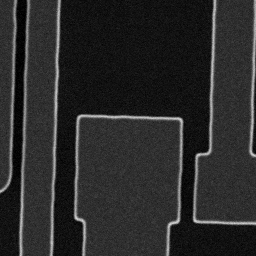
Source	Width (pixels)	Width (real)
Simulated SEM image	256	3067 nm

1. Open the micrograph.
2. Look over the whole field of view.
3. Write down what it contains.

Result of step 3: groups of lines, slits or small figures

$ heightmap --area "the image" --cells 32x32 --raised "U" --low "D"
UUDDUUUDDDDDDDDDDDDDDDDDDDDUUUUU
UUDUUUUDDDDDDDDDDDDDDDDDDDDUUUUU
UUDUUUUDDDDDDDDDDDDDDDDDDDDUUUUU
UUDUUUUDDDDDDDDDDDDDDDDDDDDUUUUU
UUDUUUUDDDDDDDDDDDDDDDDDDDDUUUUU
UUDUUUUDDDDDDDDDDDDDDDDDDDDUUUUU
UUDUUUUDDDDDDDDDDDDDDDDDDDDUUUUU
UUDUUUUDDDDDDDDDDDDDDDDDDDDUUUUU
UUDUUUUDDDDDDDDDDDDDDDDDDDDUUUUU
UUDUUUUDDDDDDDDDDDDDDDDDDDDUUUUU
UUDUUUUDDDDDDDDDDDDDDDDDDDUUUUUU
UUDUUUUDDDDDDDDDDDDDDDDDDDUUUUUU
UUDUUUUDDDDDDDDDDDDDDDDDDDUUUUUU
UUDUUUUDDDDDDDDDDDDDDDDDDDUUUUUU
UUDUUUUDDDDDDDDDDDDDDDDDDDUUUUUU
UDDUUUUDDDUUUUUUUUUUUUUDDDUUUUUU
UDDUUUUDDDUUUUUUUUUUUUUDDDUUUUUD
UDDUUUUDDDUUUUUUUUUUUUUDDDUUUUUD
UDDUUUUDDDUUUUUUUUUUUUUDDDUUUUUD
UDDUUUUDDDUUUUUUUUUUUUUDDUUUUUUU
UDDUUUUDDDUUUUUUUUUUUUUDDUUUUUUU
UDDUUUUDDDUUUUUUUUUUUUUDDUUUUUUU
UDDUUUUDDDUUUUUUUUUUUUDDUUUUUUUU
UDDUUUUDDDUUUUUUUUUUUUDDUUUUUUUU
DDDUUUUDDDUUUUUUUUUUUUDDUUUUUUUU
DDDUUUUDDUUUUUUUUUUUUUDDUUUUUUUU
DDDUUUUDDUUUUUUUUUUUUUDDUUUUUUUU
DDDUUUUDDDUUUUUUUUUUUUDDUUUUUUUU
DDDUUUUDDDDUUUUUUUUUUDDDDDDDDDDD
DDDUUUUDDDDUUUUUUUUUUDDDDDDDDDDD
DDDUUUUDDDDUUUUUUUUUUDDDDDDDDDDD
DDDUUUDDDDDUUUUUUUUUUDDDDDDDDDDD